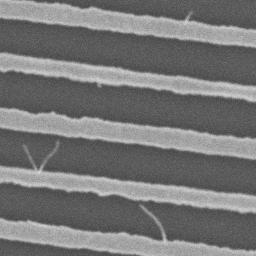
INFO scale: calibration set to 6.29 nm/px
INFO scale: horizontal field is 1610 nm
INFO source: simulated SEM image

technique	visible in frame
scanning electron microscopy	lines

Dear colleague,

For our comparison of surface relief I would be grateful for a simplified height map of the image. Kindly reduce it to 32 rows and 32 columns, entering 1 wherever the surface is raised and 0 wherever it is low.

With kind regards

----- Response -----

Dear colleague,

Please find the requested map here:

11111111000000000000000000000000
11111111111111000000000000000000
00011111111111111111110000000000
00000000000111111111111111111100
00000000000000000001111111111111
00000000000000000000000000011111
00000000000000000000000000000000
11111000000000000000000000000000
11111111111111000000000000000000
00000000111111111111000000000000
00000000000001111111111111110000
00000000000000000000001111111111
00000000000000000000000000000001
00000000000000000000000000000000
11111111000000000000000000000000
11111111111111111000000000000000
00000111111111111111111110000000
00000000000001111111111111111111
00000000000000000000001111111111
00000000000000000000000000000111
00000000000000000000000000000000
11111100000000000000000000000000
11111111111111100000000000000000
00000001111111111111111000000000
00000000000000011111111111111111
00000000000000000000000111111111
00000000000000000000000000000000
10000000000000000000000000000000
11111111100000000000000000000000
11111111111111111100000000000000
00000011111111111111111110000000
00000000000000111111111111111111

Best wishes